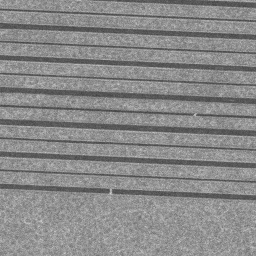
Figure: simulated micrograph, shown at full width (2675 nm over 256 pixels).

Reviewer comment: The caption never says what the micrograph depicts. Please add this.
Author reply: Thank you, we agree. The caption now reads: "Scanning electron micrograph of parallel lines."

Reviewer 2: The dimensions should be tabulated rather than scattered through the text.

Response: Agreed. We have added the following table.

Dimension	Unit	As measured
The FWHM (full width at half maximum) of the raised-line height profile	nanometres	123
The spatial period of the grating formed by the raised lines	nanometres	167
